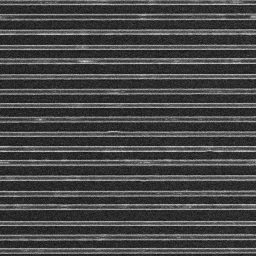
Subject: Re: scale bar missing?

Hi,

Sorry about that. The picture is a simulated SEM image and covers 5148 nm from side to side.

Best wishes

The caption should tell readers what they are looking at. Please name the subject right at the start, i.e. parallel lines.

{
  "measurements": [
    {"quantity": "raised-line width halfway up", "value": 111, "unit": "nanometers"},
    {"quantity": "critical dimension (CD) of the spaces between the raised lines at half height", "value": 191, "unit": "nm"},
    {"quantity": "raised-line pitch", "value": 0.294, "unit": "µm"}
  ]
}